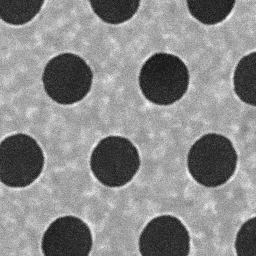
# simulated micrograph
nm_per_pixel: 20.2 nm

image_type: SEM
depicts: holes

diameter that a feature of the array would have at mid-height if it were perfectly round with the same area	1060	nm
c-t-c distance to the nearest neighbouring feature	1910	nm